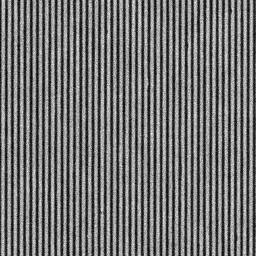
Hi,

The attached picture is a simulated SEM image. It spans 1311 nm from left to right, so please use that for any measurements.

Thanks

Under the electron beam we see parallel lines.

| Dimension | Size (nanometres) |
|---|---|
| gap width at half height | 17.9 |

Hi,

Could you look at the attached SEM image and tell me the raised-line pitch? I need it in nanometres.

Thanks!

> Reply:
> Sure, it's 31.7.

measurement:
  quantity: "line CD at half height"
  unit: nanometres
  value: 14.1